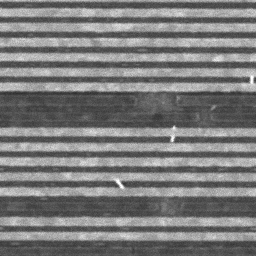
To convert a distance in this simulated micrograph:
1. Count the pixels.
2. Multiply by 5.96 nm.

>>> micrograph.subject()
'parallel lines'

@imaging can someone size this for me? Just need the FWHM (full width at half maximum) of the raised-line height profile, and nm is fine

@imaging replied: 45.5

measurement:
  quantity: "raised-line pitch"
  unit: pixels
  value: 14.9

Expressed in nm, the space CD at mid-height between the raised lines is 45.5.